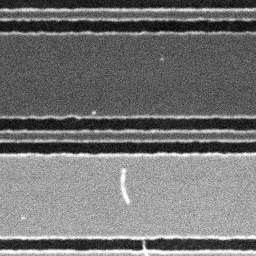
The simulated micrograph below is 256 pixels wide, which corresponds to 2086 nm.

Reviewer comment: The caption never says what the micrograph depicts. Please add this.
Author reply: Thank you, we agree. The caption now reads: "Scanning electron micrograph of lines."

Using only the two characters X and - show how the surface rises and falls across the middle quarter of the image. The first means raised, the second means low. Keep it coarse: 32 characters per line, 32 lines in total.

XXXXXXXXXXXXXXXXXXXXXXXXXXXXXXXX
XXXXXXXXXXXXXXXXXXXXXXXXXXXXXXXX
XXXXXXXXXXXXXXXXXXXXXXXXXXXXXXXX
XXXXXXXXXXXXXXXXXXXXXXXXXXXXXXXX
XXXXXXXXXXXXXXXXXXXXXXXXXXXXXXXX
XXXXXXXXXXXXXXXXXXXXXXXXXXXXXXXX
XXXXXXXXXXXXXXXXXXXXXXXXXXXXXXXX
XXXXXXXXXXXXXXXXXXXXXXXXXXXXXXXX
XXXXXXXXXXXXXXXXXXXXXXXXXXXXXXXX
XXXXXXXXXXXXXXXXXXXXXXXXXXXXXXXX
XXXXXXXXXXXXXXXXXXXXXXXXXXXXXXXX
XXXXXXXXXXXXXXXXXXXXXXXXXXXXXXXX
XXXXXXXXXXXXXXXXXXXXXXXXXXXXXXXX
---XX---X--X------------------X-
--------------------------------
--------------------------------
--------------------------------
XXXXXXXXXXXXXXXXXXXXXXXXXXXXXXXX
XXXXXXXXXXXXXXXXXXXXXXXXXXXXXXXX
--------------------------------
--------------------------------
--------------------------------
-----------------------XXX-X----
XXXXXXXXXXXXXXXXXXXXXXXXXXXXXXXX
XXXXXXXXXXXXXXXXXXXXXXXXXXXXXXXX
XXXXXXXXXXXXXXXXXXXXXXXXXXXXXXXX
XXXXXXXXXXXXXXXXXXXXXXXXXXXXXXXX
XXXXXXXXXXXXXXXXXXXXXXXXXXXXXXXX
XXXXXXXXXXXXXXXXXXXXXXXXXXXXXXXX
XXXXXXXXXXXXXXXXXXXXXXXXXXXXXXXX
XXXXXXXXXXXXXXXXXXXXXXXXXXXXXXXX
XXXXXXXXXXXXXXXXXXXXXXXXXXXXXXXX